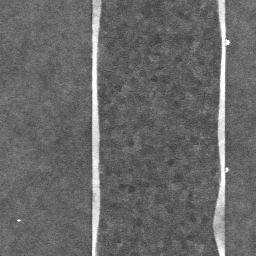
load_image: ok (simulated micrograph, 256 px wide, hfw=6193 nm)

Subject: wiring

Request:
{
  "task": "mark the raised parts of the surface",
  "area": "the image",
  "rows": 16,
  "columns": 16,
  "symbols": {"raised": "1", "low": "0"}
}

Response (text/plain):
0000001111111100
0000001111111100
0000001111111100
0000001111111100
0000001111111100
0000001111111100
0000001111111100
0000001111111100
0000001111111100
0000001111111100
0000001111111100
0000001111111100
0000001111111100
0000001111111100
0000001111111100
0000001111111100